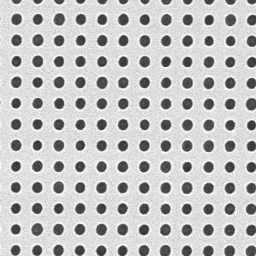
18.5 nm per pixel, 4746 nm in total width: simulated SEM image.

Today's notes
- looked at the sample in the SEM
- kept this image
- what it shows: a regular array of holes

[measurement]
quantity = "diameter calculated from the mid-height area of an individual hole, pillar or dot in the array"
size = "204 nanometers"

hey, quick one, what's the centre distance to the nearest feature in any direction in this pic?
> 386 nm